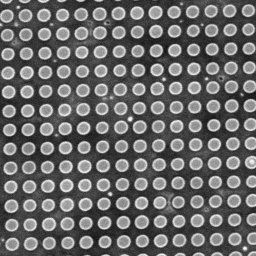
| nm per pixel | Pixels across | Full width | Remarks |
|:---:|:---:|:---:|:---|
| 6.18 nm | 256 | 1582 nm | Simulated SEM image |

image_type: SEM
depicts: a regular array of raised bodies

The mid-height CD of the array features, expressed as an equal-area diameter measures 0.0764 um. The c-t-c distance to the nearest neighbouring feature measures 114 nm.